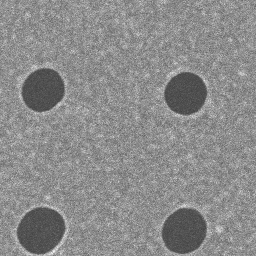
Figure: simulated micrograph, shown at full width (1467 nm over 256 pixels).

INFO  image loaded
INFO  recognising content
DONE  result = holes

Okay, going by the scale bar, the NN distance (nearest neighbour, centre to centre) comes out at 139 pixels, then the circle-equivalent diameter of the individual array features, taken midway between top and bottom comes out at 253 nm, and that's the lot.